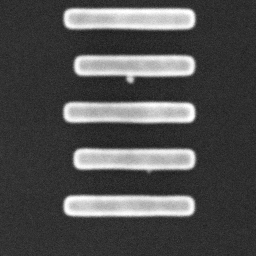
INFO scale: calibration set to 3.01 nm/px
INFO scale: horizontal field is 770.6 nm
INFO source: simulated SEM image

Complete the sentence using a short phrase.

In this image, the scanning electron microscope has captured groups of lines, slits or small figures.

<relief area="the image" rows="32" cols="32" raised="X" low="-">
--------------------------------
--------XXXXXXXXXXXXXXXX--------
--------XXXXXXXXXXXXXXXX--------
---------XXX--XXXXXXXXXX--------
--------------------------------
--------------------------------
--------------------------------
----------XXXXXXXXXXXXXX--------
---------XXXXXXXXXXXXXXX--------
--------------------------------
--------------------------------
--------------------------------
--------------------------------
--------XXXXXXXXXXXXXXXX--------
--------XXXXXXXXXXXXXXXX--------
--------------------------------
--------------------------------
--------------------------------
--------------------------------
---------XXXXXXXXXXXXXXX--------
---------XXXXXXXXXXXXXXX--------
--------------------------------
--------------------------------
--------------------------------
--------------------------------
--------XXXXXXXXXXXXXXXX--------
--------XXXXXXXXXXXXXXXX--------
--------------------------------
--------------------------------
--------------------------------
--------------------------------
--------------------------------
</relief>